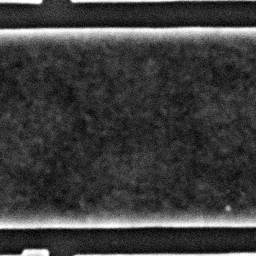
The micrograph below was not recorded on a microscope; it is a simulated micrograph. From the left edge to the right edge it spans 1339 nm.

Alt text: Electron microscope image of wiring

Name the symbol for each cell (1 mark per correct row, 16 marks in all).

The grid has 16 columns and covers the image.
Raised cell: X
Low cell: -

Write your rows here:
----------------
----------------
XXXXXXXXXXXXXXXX
XXXXXXXXXXXXXXXX
XXXXXXXXXXXXXXXX
XXXXXXXXXXXXXXXX
XXXXXXXXXXXXXXXX
XXXXXXXXXXXXXXXX
XXXXXXXXXXXXXXXX
XXXXXXXXXXXXXXXX
XXXXXXXXXXXXXXXX
XXXXXXXXXXXXXXXX
XXXXXXXXXXXXXXXX
XXXXXXXXXXXXXXXX
----------------
----------------